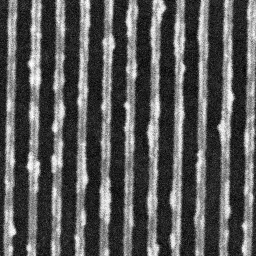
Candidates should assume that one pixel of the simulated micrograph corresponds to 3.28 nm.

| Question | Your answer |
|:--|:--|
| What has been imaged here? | parallel lines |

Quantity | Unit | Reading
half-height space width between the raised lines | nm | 53.3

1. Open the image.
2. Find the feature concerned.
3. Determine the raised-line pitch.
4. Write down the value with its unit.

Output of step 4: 78.6 nanometers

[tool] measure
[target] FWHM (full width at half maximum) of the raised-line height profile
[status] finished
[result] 0.025 µm